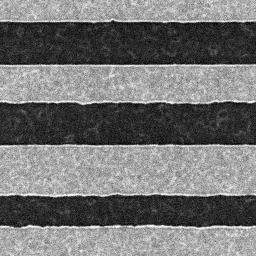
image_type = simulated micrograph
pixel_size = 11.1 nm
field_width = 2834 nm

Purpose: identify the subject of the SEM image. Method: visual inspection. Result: one or a few lines or trenches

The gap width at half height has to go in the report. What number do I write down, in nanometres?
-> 476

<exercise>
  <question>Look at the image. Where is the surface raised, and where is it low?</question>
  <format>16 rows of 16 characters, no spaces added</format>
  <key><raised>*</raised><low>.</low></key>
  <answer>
****************
................
................
................
****************
****************
................
................
................
****************
****************
****************
................
................
****************
****************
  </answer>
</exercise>